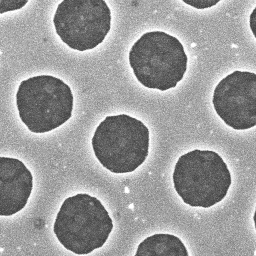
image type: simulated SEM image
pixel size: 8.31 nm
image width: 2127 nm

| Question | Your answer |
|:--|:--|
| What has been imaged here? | holes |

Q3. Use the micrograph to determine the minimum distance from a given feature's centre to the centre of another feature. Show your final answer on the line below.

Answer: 728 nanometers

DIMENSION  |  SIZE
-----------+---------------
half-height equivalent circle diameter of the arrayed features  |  0.485 micrometres